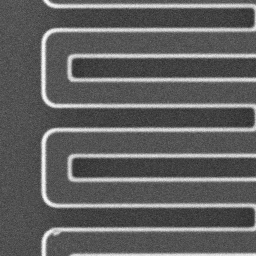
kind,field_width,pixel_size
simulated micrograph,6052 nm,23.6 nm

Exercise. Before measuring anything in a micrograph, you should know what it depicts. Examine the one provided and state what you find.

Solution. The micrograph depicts groups of lines, slits or small figures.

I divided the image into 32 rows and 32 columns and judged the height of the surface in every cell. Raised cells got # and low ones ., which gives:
......##########################
................................
................................
................................
......##########################
.....###########################
.....###########################
.....####.......................
.....####.......................
.....####.......................
.....###########################
.....###########################
......##########################
................................
................................
................................
......##########################
.....###########################
.....###########################
.....#####......................
.....####.......................
.....####.......................
.....#####.....#################
.....###########################
......##########################
......##########################
................................
................................
................................
......##########################
.....###########################
.....###########################